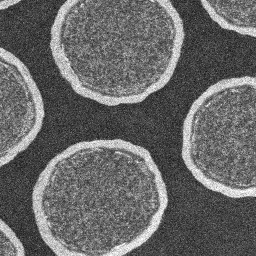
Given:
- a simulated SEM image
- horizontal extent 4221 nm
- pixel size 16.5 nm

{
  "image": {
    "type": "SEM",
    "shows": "raised bodies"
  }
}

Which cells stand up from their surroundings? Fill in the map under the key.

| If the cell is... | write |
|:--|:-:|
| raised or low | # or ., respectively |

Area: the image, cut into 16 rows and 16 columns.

....#######..###
....#######...##
...########.....
....#######.....
#...#######.....
##...#####....##
##..........####
##..........####
##..........####
#...#####...####
...#######..####
...#######...###
..########......
...#######......
...######.......
#...####........